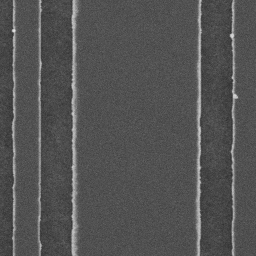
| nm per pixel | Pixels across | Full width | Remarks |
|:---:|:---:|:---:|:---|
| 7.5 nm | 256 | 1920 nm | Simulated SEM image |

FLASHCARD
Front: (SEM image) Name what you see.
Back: lines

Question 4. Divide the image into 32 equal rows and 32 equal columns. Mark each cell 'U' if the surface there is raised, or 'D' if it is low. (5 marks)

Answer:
DDUUUDDDDUUUUUUUUUUUUUUUUDDDDUUU
DDUUUDDDDUUUUUUUUUUUUUUUUDDDDUUU
DDUUUDDDDUUUUUUUUUUUUUUUUDDDDUUU
DDUUUDDDDUUUUUUUUUUUUUUUUDDDDUUU
DDUUUDDDDUUUUUUUUUUUUUUUUDDDDUUU
DDUUUDDDDUUUUUUUUUUUUUUUUDDDDUUU
DDUUUDDDDUUUUUUUUUUUUUUUUDDDDUUU
DDUUUDDDDUUUUUUUUUUUUUUUUDDDDUUU
DDUUUDDDDUUUUUUUUUUUUUUUUDDDDUUU
DDUUUDDDDUUUUUUUUUUUUUUUUDDDDUUU
DDUUUDDDDUUUUUUUUUUUUUUUUDDDDUUU
DDUUUDDDDUUUUUUUUUUUUUUUUDDDDUUU
DDUUUDDDDUUUUUUUUUUUUUUUUDDDDUUU
DDUUUDDDDUUUUUUUUUUUUUUUUDDDDUUU
DDUUUDDDDUUUUUUUUUUUUUUUUDDDDUUU
DDUUUDDDDUUUUUUUUUUUUUUUUDDDDUUU
DDUUUDDDDUUUUUUUUUUUUUUUUDDDDUUU
DDUUUDDDDUUUUUUUUUUUUUUUUDDDDUUU
DDUUUDDDDUUUUUUUUUUUUUUUUDDDDUUU
DDUUUDDDDUUUUUUUUUUUUUUUUDDDDUUU
DDUUUDDDDUUUUUUUUUUUUUUUUDDDDUUU
DDUUUDDDDUUUUUUUUUUUUUUUUDDDDUUU
DDUUUDDDDUUUUUUUUUUUUUUUUDDDDUUU
DDUUUDDDDUUUUUUUUUUUUUUUUDDDDUUU
DDUUUDDDDUUUUUUUUUUUUUUUUDDDDUUU
DDUUUDDDDUUUUUUUUUUUUUUUUDDDDUUU
DDUUUDDDDUUUUUUUUUUUUUUUUDDDDUUU
DDUUUDDDDUUUUUUUUUUUUUUUUDDDDUUU
DDUUUDDDDUUUUUUUUUUUUUUUUDDDDUUU
DDUUUDDDDUUUUUUUUUUUUUUUUDDDDUUU
DDUUUDDDDUUUUUUUUUUUUUUUUDDDDUUU
DDUUUDDDDUUUUUUUUUUUUUUUUDDDDUUU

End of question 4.